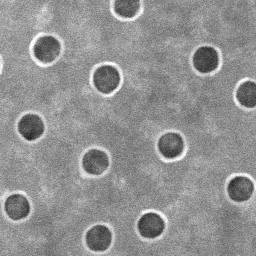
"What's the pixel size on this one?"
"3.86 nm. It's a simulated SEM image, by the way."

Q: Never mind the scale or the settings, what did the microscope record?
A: a regular array of holes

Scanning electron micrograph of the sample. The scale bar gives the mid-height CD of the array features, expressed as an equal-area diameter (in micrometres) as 0.105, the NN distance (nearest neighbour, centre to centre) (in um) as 0.283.